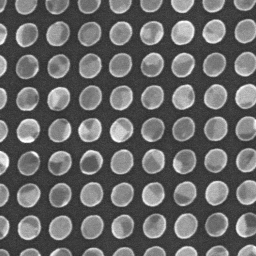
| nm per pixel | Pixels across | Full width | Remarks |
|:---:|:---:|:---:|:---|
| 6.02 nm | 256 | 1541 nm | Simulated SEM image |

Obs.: a regular array of raised bodies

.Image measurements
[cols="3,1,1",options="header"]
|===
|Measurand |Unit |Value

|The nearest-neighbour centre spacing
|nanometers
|187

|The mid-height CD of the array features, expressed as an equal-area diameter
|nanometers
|138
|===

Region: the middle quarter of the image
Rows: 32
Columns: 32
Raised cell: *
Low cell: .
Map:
*...*****..******..******..*****
*...*****...****...*****...*****
....****....****....****....***.
................................
................................
..............................*.
*....****...*****...****....****
*...*****...*****...*****..*****
*...*****...*****...*****..*****
*...*****...*****...****...*****
*...****....****....****....***.
................................
................................
.............................**.
*....****....****...*****...****
**..*****...*****...*****..*****
**..*****...*****..******..*****
*...*****...*****...*****..*****
*...****....****....****....***.
................................
................................
......................*.........
*....****....****...*****...****
**..*****...*****...*****...****
**..*****...*****...*****..*****
*...*****...*****...*****..*****
*...*****...****....****....****
................................
................................
................................
*....****....****....***....****
**...****...*****...*****...****